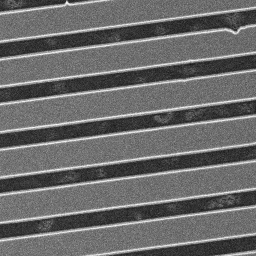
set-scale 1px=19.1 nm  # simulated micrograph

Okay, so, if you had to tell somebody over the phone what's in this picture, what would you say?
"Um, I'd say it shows parallel lines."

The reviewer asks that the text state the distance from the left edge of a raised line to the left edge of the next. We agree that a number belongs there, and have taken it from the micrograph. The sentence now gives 858 nm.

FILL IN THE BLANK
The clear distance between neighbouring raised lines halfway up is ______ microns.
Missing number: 0.301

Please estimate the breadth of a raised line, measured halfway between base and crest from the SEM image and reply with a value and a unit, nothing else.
549 nanometres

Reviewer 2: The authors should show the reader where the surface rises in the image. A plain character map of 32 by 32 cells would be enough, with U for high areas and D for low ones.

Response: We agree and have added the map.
DDDDDDDDUUUUUUUUUUUUUUUUUUUUUUUU
DUUUUUUUUUUUUUUUUUUUUUUUUUUUUDDD
UUUUUUUUUUUUUUUUUUUUUDDDDDDDDDDD
UUUUUUUUUUUUUUDDDDDDDDDDDDDDDDUU
UUUUUUDDDDDDDDDDDDDDDUUUUUUUUUUU
DDDDDDDDDDDDDDUUUUUUUUUUUUUUUUUU
DDDDDDUUUUUUUUUUUUUUUUUUUUUUUUUU
UUUUUUUUUUUUUUUUUUUUUUUUUUDDDDDD
UUUUUUUUUUUUUUUUUUDDDDDDDDDDDDDD
UUUUUUUUUUUDDDDDDDDDDDDDDDUUUUUU
UUUDDDDDDDDDDDDDDDUUUUUUUUUUUUUU
DDDDDDDDDDDUUUUUUUUUUUUUUUUUUUUU
DDDUUUUUUUUUUUUUUUUUUUUUUUUUUUUD
UUUUUUUUUUUUUUUUUUUUUUUUDDDDDDDD
UUUUUUUUUUUUUUUUDDDDDDDDDDDDDDDU
UUUUUUUUUDDDDDDDDDDDDDDDUUUUUUUU
UDDDDDDDDDDDDDDDUUUUUUUUUUUUUUUU
DDDDDDDDUUUUUUUUUUUUUUUUUUUUUUUU
DUUUUUUUUUUUUUUUUUUUUUUUUUUUDDDD
UUUUUUUUUUUUUUUUUUUUUDDDDDDDDDDD
UUUUUUUUUUUUUUDDDDDDDDDDDDDDDUUU
UUUUUUDDDDDDDDDDDDDDDUUUUUUUUUUU
DDDDDDDDDDDDDUUUUUUUUUUUUUUUUUUU
DDDDDDUUUUUUUUUUUUUUUUUUUUUUUUUU
UUUUUUUUUUUUUUUUUUUUUUUUUUDDDDDD
UUUUUUUUUUUUUUUUUUDDDDDDDDDDDDDD
UUUUUUUUUUUDDDDDDDDDDDDDDDUUUUUU
UUUDDDDDDDDDDDDDDDDUUUUUUUUUUUUU
DDDDDDDDDDDUUUUUUUUUUUUUUUUUUUUU
DDDUUUUUUUUUUUUUUUUUUUUUUUUUUUDD
UUUUUUUUUUUUUUUUUUUUUUUDDDDDDDDD
UUUUUUUUUUUUUUUDDDDDDDDDDDDDDDDU